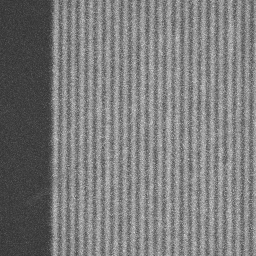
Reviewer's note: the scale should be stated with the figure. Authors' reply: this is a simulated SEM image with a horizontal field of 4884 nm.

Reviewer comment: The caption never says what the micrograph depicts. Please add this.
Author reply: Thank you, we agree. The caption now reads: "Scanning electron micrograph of parallel lines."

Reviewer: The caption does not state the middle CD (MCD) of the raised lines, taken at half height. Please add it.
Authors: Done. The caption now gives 0.112 micrometres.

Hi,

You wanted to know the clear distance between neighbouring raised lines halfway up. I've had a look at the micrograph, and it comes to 52.5 nanometres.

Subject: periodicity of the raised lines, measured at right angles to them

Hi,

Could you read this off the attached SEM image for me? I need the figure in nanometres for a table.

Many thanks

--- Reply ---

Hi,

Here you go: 166